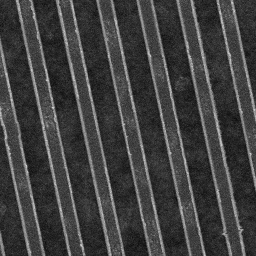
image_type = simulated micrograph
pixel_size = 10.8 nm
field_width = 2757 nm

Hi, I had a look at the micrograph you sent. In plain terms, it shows parallel lines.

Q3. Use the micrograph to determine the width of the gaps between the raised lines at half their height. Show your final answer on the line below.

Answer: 0.27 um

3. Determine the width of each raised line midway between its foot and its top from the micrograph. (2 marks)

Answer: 156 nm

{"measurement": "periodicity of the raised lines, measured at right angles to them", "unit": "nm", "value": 423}